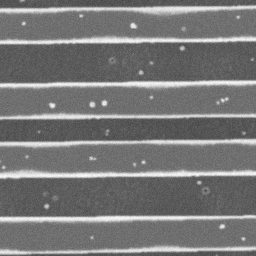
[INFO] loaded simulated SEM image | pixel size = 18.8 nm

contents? lines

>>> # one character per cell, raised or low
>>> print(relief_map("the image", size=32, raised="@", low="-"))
--------------------------------
@@@@@@@@@@@@@@@@@@@@@@@@@@@@@@@@
@@@@@@@@@@@@@@@@@@@@@@@@@@@@@@@@
@@@@@@@@@@@@@@@@@@@@@@@@@@@@@@@@
@@@@@@@@@@@@@@@@@@@@@@@@@@@@@@@@
--------------------------------
--------------------------------
--------------------------------
--------------------------------
--------------------------------
------------@@@@@@@@@@@@@@@@@@@@
@@@@@@@@@@@@@@@@@@@@@@@@@@@@@@@@
@@@@@@@@@@@@@@@@@@@@@@@@@@@@@@@@
@@@@@@@@@@@@@@@@@@@@@@@@@@@@@@@@
@@@@@@@@@@@@@@@@@@@@@@@@@@@@@@@-
--------------------------------
--------------------------------
--------------------------------
@@@@@@@@@@@@@@@@@@@@@@@@@@@@@@@@
@@@@@@@@@@@@@@@@@@@@@@@@@@@@@@@@
@@@@@@@@@@@@@@@@@@@@@@@@@@@@@@@@
@@@@@@@@@@@@@@@@@@@@@@@@@@@@@@@@
--------------------------------
--------------------------------
--------------------------------
--------------------------------
--------------------------------
@@@@@@@@@@@@@@@@@@@@@@@@@@@@@@@@
@@@@@@@@@@@@@@@@@@@@@@@@@@@@@@@@
@@@@@@@@@@@@@@@@@@@@@@@@@@@@@@@@
@@@@@@@@@@@@@@@@@@@@@@@@@@@@@@@@
@@@@@@@@@-----------------------